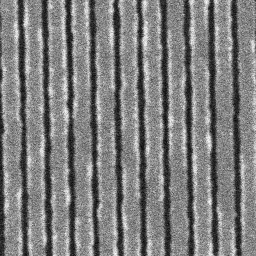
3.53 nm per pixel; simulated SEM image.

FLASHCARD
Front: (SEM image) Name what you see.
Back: parallel lines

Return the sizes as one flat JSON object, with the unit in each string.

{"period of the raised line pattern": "23.7 pixels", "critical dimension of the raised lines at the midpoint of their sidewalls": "0.0591 micrometres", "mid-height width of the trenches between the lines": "23.4 nm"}